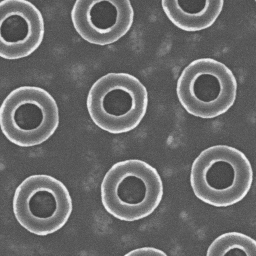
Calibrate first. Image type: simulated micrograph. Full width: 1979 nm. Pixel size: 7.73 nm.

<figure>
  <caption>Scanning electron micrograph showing ring-shaped raised bodies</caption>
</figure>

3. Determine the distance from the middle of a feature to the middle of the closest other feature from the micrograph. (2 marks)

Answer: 686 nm